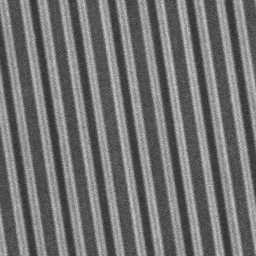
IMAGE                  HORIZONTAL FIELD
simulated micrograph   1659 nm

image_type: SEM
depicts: parallel lines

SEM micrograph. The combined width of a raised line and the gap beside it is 0.125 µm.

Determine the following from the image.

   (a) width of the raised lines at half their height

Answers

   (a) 52.1 nm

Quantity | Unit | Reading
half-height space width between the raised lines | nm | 64.1